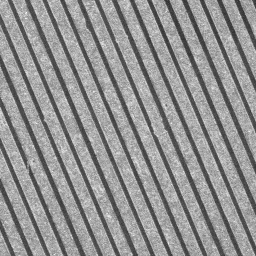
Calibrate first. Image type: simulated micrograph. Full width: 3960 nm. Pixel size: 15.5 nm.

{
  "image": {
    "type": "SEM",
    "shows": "parallel lines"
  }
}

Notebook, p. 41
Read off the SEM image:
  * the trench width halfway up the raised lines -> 80.1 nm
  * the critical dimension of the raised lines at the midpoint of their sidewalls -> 11.2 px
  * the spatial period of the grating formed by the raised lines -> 249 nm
